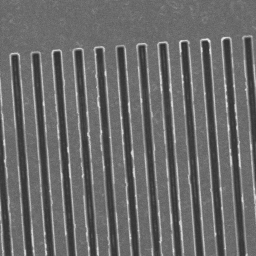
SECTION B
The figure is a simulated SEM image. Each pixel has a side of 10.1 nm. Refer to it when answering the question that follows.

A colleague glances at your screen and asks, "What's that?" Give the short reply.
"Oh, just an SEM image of parallel lines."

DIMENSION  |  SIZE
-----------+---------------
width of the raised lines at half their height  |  146 nm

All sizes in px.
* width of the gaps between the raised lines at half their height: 6.74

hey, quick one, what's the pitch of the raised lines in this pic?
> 0.215 um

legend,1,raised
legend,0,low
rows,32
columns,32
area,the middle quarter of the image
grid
11100111001111011110011100111101
11100111001111011110011100111100
11100111001111001110011100111100
11100111001111001110011100111100
11100111001111001110011100111100
11100111001111001110011100111100
11100111000111001110011110111100
11100111100111001110011110011100
11100111100111001110011110011100
11100011100111001110001110011100
11100011100111001111001110011100
11110011100111001111001110011100
11110011100111001111001110011100
11110011100111001111001110011100
11110011100111101111001110011100
11110011100111100111001110011100
01110011100111100111001110011110
01110011100111100111001110011110
01110011100111100111001110001110
01110011100011100111001110001110
01110011110011100111001111001110
01110011110011100111001111001110
01110011110011100111001111001110
01110001110011100111101111001110
01111001110011100111101111001110
01111001110011100111100111001110
01111001110011100111100111001110
01111001110011110111100111001111
01111001110011110111100111001110
00111001110011110011100111001111
00111001110011110011100111001111
00111001110011110011100111001111